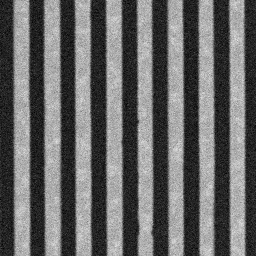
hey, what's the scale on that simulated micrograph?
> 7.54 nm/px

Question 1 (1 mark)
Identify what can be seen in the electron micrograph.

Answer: parallel lines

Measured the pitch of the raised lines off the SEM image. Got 0.232 um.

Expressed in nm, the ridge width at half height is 105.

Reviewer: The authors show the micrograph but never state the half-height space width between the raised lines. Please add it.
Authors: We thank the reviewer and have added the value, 126 nanometres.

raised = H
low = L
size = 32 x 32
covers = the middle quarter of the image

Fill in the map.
LLLHHHLLLLLHHHLLLLLHHHLLLLHHHHLL
LLLHHHLLLLLHHHLLLLLHHHLLLLHHHHLL
LLLHHHLLLLLHHHLLLLLHHHLLLLHHHHLL
LLLHHHLLLLLHHHLLLLLHHHLLLLHHHHLL
LLLHHHLLLLLHHHLLLLLHHHLLLLHHHHLL
LLLHHHLLLLLHHHLLLLLHHHLLLLHHHHLL
LLLHHHLLLLLHHHLLLLLHHHLLLLHHHHLL
LLLHHHLLLLLHHHLLLLLHHHLLLLHHHHLL
LLLHHHLLLLLHHHLLLLLHHHLLLLHHHHLL
LLLHHHLLLLLHHHLLLLLHHHLLLLHHHHLL
LLLHHHLLLLLHHHLLLLLHHHLLLLHHHHLL
LLLHHHLLLLLHHHLLLLLHHHLLLLHHHHLL
LLLHHHLLLLLHHHLLLLLHHHLLLLHHHHLL
LLLHHHLLLLLHHHLLLLLHHHLLLLHHHHLL
LLLHHHLLLLLHHHLLLLLHHHLLLLHHHHLL
LLLHHHLLLLLHHHLLLLLHHHLLLLHHHHLL
LLLHHHLLLLLHHHLLLLLHHHLLLLHHHHLL
LLLHHHLLLLLHHHLLLLLHHHLLLLHHHHLL
LLLHHHLLLLLHHHLLLLLHHHLLLLHHHHLL
LLLHHHLLLLLHHHLLLLLHHHLLLLHHHHLL
LLLHHHLLLLLHHHLLLLLHHHLLLLHHHHLL
LLLHHHLLLLLHHHLLLLLHHHLLLLHHHHLL
LLLHHHLLLLLHHHLLLLLHHHLLLLHHHHLL
LLLHHHLLLLLHHHLLLLLHHHLLLLHHHHLL
LLLHHHLLLLLHHHLLLLLHHHLLLLHHHHLL
LLLHHHLLLLLHHHLLLLLHHHLLLLHHHHLL
LLLHHHLLLLLHHHLLLLLHHHLLLLHHHHLL
LLLHHHHLLLLHHHLLLLLHHHLLLLHHHHLL
LLLHHHLLLLLHHHLLLLLHHHLLLLHHHHLL
LLLHHHLLLLLHHHLLLLLHHHLLLLHHHHLL
LLLHHHLLLLLHHHLLLLLHHHLLLLHHHHLL
LLLHHHLLLLLHHHLLLLLHHHLLLLHHHHLL